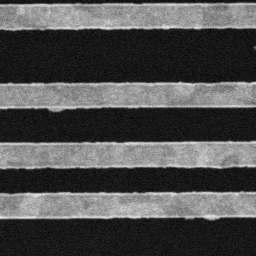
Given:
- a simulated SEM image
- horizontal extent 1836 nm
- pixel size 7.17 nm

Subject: lines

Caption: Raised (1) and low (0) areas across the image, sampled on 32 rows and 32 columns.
00000000000001111011111111111111
11111111111111111111111111111111
11111111111111111111111111111111
11111111111011101010100010000000
00000000000000000000000000000000
00000000000000000000000000000000
00000000000000000000000000000000
00000000000000000000000000000000
00000000000000000000000000000000
00000000000000000000000000000000
00001111111111111111111111111111
11111111111111111111111111111111
11111111111111111111111111111111
00000000000000000000000000000000
00000000000000000000000000000000
00000000000000000000000000000000
00000000000000000000000000000000
00000000000000000000000000000000
11111111111111111111111111111111
11111111111111111111111111111111
11111111111111111111111111111111
00000000000000000000000000000000
00000000000000000000000000000000
00000000000000000000000000000000
11111111111111111111111111111111
11111111111111111111111111111111
11111111111111111111111111111111
00000000000000000000000000000000
00000000000000000000000000000000
00000000000000000000000000000000
00000000000000000000000000000000
00000000000000000000000000000000